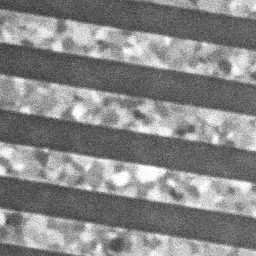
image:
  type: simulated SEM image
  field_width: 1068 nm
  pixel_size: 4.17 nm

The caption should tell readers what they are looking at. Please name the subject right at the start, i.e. one or a few lines or trenches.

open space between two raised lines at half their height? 34.7 px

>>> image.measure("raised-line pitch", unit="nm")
274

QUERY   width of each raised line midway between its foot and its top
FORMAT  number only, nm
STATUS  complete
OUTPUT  129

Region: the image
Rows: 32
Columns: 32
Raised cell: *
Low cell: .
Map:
.....................***********
*..........................*****
********........................
**************..................
********************............
..************************......
........************************
...............*****************
.....................***********
...........................*****
******..........................
************....................
*******************.............
*************************.......
......*************************.
............********************
..................**************
........................********
****...........................*
**********......................
****************................
**********************..........
....************************....
..........**********************
................****************
.......................*********
**...........................***
********........................
**************..................
********************............
..************************......
........************************